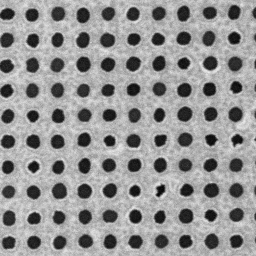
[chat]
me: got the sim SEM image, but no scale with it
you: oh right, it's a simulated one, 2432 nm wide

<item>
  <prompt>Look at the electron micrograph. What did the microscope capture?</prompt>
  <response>a regular array of holes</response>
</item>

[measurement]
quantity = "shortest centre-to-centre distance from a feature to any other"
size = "234 nanometers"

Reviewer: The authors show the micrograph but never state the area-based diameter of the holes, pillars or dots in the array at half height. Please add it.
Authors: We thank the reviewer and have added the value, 0.138 µm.